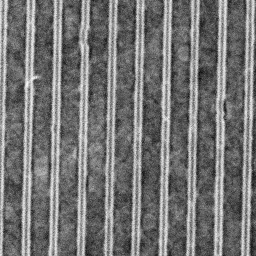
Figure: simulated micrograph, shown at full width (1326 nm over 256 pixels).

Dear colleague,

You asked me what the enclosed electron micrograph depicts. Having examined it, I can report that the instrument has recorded parallel lines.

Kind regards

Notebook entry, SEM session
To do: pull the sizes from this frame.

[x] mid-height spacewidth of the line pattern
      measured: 21.5 px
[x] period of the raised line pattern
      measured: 142 nanometres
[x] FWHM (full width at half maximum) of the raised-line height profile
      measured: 5.87 px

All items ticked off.